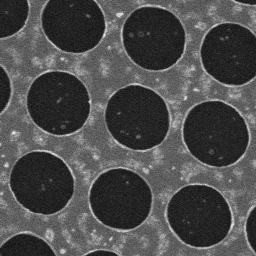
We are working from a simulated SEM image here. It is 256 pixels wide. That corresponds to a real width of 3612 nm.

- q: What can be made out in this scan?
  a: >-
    holes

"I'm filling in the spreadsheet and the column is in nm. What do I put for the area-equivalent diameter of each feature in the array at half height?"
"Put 899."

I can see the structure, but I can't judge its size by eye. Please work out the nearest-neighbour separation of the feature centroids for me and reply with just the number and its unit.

1130 nanometres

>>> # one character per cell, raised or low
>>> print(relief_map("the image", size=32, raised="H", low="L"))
LLLLHHLLLLLLHHHHHHHHHHHHHHHHHHHL
LLLLHLLLLLLLLHHHHLLLLHHHHHHHHHHH
LLLHHLLLLLLLLHHHLLLLLLHHHHHHHHHH
LLLHHLLLLLLLLHHLLLLLLLLHHHHLLLLH
LHHHHHLLLLLLLHHLLLLLLLLHHHLLLLLL
HHHHHHHLLLLLHHHLLLLLLLLHHLLLLLLL
HHHHHHHHLLHHHHHHLLLLLLLHHLLLLLLL
HHHHHHHHHHHHHHHHLLLLLLHHHLLLLLLL
HHHHHHHHHHHHHHHHHHLLLHHHHHLLLLLL
LHHHHLLLLHHHHHHHHHHHHHHHHHLLLLLL
LHHHLLLLLLHHHHHHHHHHHHHHHHHHLLHH
LHHHLLLLLLLHHHHLLLLHHHHHHHHHHHHH
LHHLLLLLLLLHHHLLLLLLHHHHHHHHHHHH
LHHLLLLLLLLHHLLLLLLLLHHHLLLLLHHH
HHHHLLLLLLLHHLLLLLLLLHHLLLLLLLHH
HHHHHLLLLLLHHLLLLLLLLHHLLLLLLLLH
HHHHHHLLLHHHHHLLLLLLLHHLLLLLLLLH
HHHHHHHHHHHHHHLLLLLLHHHLLLLLLLLH
HHHHHHHHHHHHHHHHLLLHHHHLLLLLLLLH
HHHLLLLHHHHHHHHHHHHHHHHHLLLLLLHH
HHLLLLLLHHHHHHHHHHHHHHHHHHLLLHHH
HLLLLLLLLHHHHLLLLHHHHHHHHHHHHHHH
HLLLLLLLLHHHLLLLLLHHHHHHHHHHHHHH
HLLLLLLLLHHLLLLLLLLHHHHLLLLHHHHH
HHLLLLLLLHHLLLLLLLLHHHLLLLLLHHHH
HHHLLLLLHHHLLLLLLLLHHLLLLLLLHHHH
HHHHLLLHHHHHLLLLLLLHHLLLLLLLLHHL
HHHHHHHHHHHHLLLLLLHHHLLLLLLLLHHL
HHHHHHHHHHHHHHLLLHHHHLLLLLLLLHHL
HHLLLHHHHHHHHHHHHHHHHHLLLLLLHHHL
LLLLLLHHHHHHHHHHHHHHHHHLLLLHHHHL
LLLLLLLHHHHHLLHHHHHHHHHHHHHHHHHH